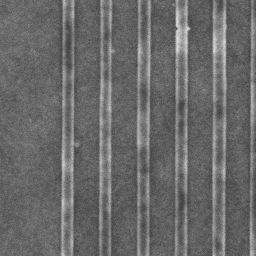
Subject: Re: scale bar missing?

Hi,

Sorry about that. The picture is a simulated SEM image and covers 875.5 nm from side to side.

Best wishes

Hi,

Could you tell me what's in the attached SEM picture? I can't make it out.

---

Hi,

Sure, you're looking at parallel lines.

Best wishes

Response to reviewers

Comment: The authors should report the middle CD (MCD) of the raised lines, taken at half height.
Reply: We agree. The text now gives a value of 0.0389 micrometres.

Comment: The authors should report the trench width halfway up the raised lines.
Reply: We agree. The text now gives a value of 89.8 nanometres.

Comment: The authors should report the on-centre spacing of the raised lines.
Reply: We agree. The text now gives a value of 0.129 µm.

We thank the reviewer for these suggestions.